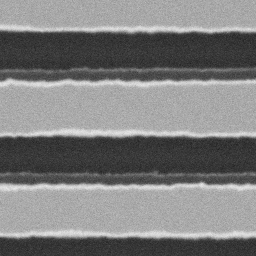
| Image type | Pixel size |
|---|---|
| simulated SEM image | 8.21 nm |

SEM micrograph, lines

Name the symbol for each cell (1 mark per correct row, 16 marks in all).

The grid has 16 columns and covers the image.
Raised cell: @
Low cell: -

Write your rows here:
@@@@@@@@@@@@@@@@
@@@@@@@@@@@@@@@@
----------------
----------------
----------------
@@@@@@@@@@@@@@@@
@@@@@@@@@@@@@@@@
@@@@@@@@@@@@@@@@
@@@--@-@---@@@@@
----------------
----------------
------------@---
@@@@@@@@@@@@@@@@
@@@@@@@@@@@@@@@@
@@@@@@@@@@@@@@@@
----------------